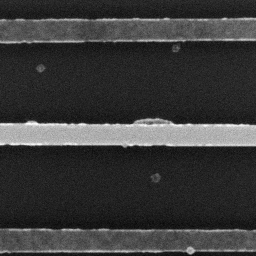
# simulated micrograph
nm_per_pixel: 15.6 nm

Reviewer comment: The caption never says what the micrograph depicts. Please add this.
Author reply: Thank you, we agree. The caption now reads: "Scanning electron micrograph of lines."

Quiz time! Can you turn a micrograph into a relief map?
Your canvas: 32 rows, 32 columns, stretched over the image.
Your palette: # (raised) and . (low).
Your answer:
................................
................................
#.#..######.####################
################################
################################
................................
................................
................................
................................
................................
................................
................................
................................
................................
................................
..................###...........
################################
################################
................................
................................
................................
................................
................................
................................
................................
................................
................................
................................
................................
################################
################################
##.....................#........